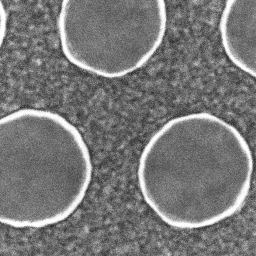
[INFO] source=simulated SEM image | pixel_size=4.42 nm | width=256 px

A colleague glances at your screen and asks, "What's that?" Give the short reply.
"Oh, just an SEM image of raised bodies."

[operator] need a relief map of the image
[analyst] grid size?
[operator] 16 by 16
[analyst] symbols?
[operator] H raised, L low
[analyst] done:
LLLLHHHHHHLLLLHH
LLLLHHHHHHLLLLHH
LLLLHHHHHHLLLLHH
LLLLHHHHHLLLLLHH
LLLLLLHHLLLLLLLL
LLLLLLLLLLLLLLLL
LLLLLLLLLLLLLLLL
HHHHLLLLLLLHHHLL
HHHHHLLLLLHHHHHL
HHHHHLLLLHHHHHHL
HHHHHHLLLHHHHHHH
HHHHHLLLLHHHHHHL
HHHHHLLLLHHHHHHL
HHHHLLLLLLHHHHLL
LLLLLLLLLLLLLLLL
LLLLLLLLLLLLLLLL